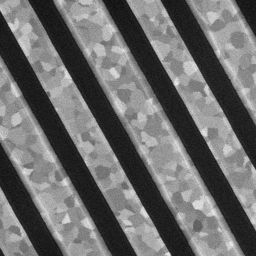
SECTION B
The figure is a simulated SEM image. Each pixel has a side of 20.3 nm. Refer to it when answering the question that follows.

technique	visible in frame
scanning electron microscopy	lines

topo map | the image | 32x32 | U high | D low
UUUUDDDUUUUUUDDDUUUUDDDDUUUUUDDD
UUUUDDDDUUUUUDDDDUUUUDDDUUUUUUDD
DUUUUDDDUUUUUUDDDUUUUDDDDUUUUUDD
DUUUUDDDDUUUUUDDDDUUUUDDDDUUUUUD
DDUUUUDDDUUUUUUDDDUUUUUDDDUUUUUD
DDUUUUDDDDUUUUUDDDDUUUUDDDDUUUUU
DDDUUUUDDDDUUUUUDDDUUUUUDDDUUUUU
DDDDUUUUDDDUUUUUUDDDUUUUDDDDUUUU
UDDDUUUUDDDDUUUUUDDDDUUUUDDDUUUU
UDDDDUUUUDDDUUUUUUDDDUUUUDDDDUUU
UUDDDUUUUDDDDUUUUUDDDDUUUUDDDUUU
UUDDDDUUUUDDDUUUUUUDDDUUUUDDDDUU
UUUDDDUUUUDDDDUUUUUDDDDUUUUDDDUU
UUUDDDDUUUUDDDUUUUUUDDDUUUUUDDDU
UUUUDDDUUUUUDDDUUUUUDDDDUUUUDDDD
UUUUUDDDUUUUDDDDUUUUUDDDDUUUUDDD
UUUUUDDDUUUUUDDDUUUUUUDDDUUUUDDD
UUUUUUDDDUUUUDDDDUUUUUDDDDUUUUDD
DUUUUUDDDDUUUUDDDUUUUUUDDDUUUUDD
DUUUUUUDDDUUUUDDDDUUUUUDDDDUUUUD
DDUUUUUDDDDUUUUDDDUUUUUUDDDUUUUD
DDUUUUUUDDDUUUUDDDDUUUUUDDDDUUUU
DDDUUUUUDDDDUUUUDDDUUUUUUDDDUUUU
DDDDUUUUUDDDUUUUUDDDUUUUUUDDDUUU
UDDDUUUUUUDDDUUUUDDDDUUUUUDDDDUU
UDDDDUUUUUDDDDUUUUDDDUUUUUUDDDUU
UUDDDUUUUUUDDDUUUUDDDDUUUUUDDDDU
UUDDDDUUUUUDDDDUUUUDDDUUUUUUDDDU
UUUDDDUUUUUUDDDUUUUDDDDUUUUUDDDD
UUUDDDDUUUUUDDDDUUUUDDDUUUUUUDDD
UUUUDDDUUUUUUDDDUUUUUDDDUUUUUDDD
UUUUUDDDUUUUUDDDDUUUUDDDDUUUUUDD